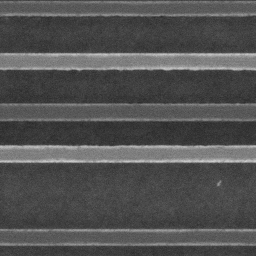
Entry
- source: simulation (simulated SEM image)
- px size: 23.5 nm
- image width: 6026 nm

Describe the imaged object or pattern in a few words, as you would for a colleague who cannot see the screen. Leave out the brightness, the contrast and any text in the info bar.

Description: lines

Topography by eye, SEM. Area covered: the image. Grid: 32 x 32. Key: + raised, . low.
++++++++++++++++++++++++++++++++
++++++++++++++++++++++++++++++++
................................
................................
................................
................................
................................
++++++++++++++++++++++++++++++++
++++++++++++++++++++++++++++++++
................................
................................
................................
................................
++++++++++++++++++++++++++++++++
++++++++++++++++++++++++++++++++
................................
................................
................................
++++++++++++++++++++++++++++++++
++++++++++++++++++++++++++++++++
................................
................................
................................
................................
................................
................................
................................
................................
................................
++++++++++++++++++++++++++++++++
+++++++++++++++++++++++++..+++++
................................